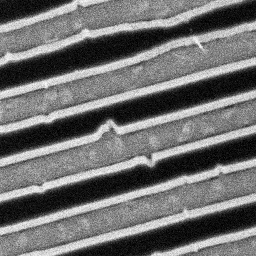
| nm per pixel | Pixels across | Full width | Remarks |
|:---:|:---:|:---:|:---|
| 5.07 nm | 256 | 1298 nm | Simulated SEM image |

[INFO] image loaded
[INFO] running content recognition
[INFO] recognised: one or a few lines or trenches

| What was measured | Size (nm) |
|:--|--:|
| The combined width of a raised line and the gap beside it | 334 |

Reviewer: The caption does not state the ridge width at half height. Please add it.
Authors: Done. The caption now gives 0.165 µm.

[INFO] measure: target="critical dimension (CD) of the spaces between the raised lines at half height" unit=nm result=170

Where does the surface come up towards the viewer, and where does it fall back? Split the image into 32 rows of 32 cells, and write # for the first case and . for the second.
#########..................#####
#######.................########
####..................##########
#..............################.
..........#################.....
........##############..........
....################............
#################...............
#############...............####
#########................#######
######...............###########
##................##############
..............###############...
..........################......
.......###############..........
...###############..............
#############.................##
###########................#####
#######................#########
###.................############
................###############.
............###############.....
........###############.........
.....###############............
.###############................
#############................###
#########................#######
######...............###########
##................##############
..............################..
..........################......
.......###############..........